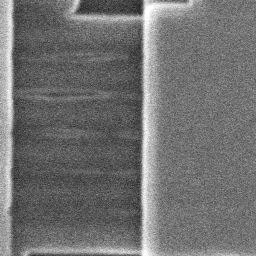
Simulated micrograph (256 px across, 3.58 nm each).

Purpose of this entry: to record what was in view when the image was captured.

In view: wiring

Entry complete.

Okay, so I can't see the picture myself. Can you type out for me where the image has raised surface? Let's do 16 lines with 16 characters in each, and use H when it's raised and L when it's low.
HLLLLLLLLHHHHHHH
HLLLLLLLLHHHHHHH
HLLLLLLLLHHHHHHH
HLLLLLLLLHHHHHHH
HLLLLLLLLHHHHHHH
HLLLLLLLLHHHHHHH
HLLLLLLLLHHHHHHH
HLLLLLLLLHHHHHHH
HLLLLLLLLHHHHHHH
HLLLLLLLLHHHHHHH
HLLLLLLLLHHHHHHH
HLLLLLLLLHHHHHHH
HLLLLLLLLHHHHHHH
HLLLLLLLLHHHHHHH
HLLLLLLLLHHHHHHH
HLLLLLLLLHHHHHHH